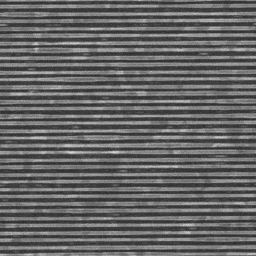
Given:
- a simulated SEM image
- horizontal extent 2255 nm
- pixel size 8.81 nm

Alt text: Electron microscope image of parallel lines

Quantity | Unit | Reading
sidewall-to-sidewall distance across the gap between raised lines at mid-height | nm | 39.6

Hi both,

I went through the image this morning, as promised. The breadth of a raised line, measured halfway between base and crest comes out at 19.8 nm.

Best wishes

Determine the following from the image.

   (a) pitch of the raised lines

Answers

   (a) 64.4 nm